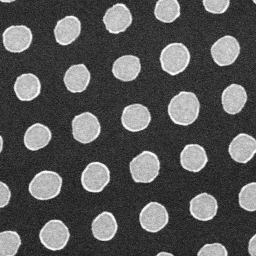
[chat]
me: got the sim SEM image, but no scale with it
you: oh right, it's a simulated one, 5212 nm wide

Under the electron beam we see a regular array of raised bodies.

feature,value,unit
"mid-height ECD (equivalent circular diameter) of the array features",27.5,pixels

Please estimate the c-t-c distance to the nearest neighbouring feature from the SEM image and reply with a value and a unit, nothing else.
1000 nm